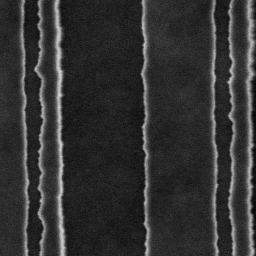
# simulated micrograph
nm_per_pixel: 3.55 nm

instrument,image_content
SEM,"lines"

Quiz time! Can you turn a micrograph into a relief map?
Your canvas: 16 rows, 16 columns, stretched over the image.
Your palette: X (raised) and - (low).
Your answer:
XXXX-----XXXXXXX
XXXX-----XXXXXXX
XXXX-----XXXXXXX
XXXX-----XXXXXXX
XXXX-----XXXXXXX
XXXX-----XXXXXXX
XXXX-----XXXXXXX
XXXX-----XXXXXXX
XXXX-----XXXXXXX
XXXX-----XXXXXXX
XXXX-----XXXXXXX
XXXX-----XXXXXXX
XXXX-----XXXXXXX
XXXX-----XXXXXXX
XXXX-----XXXXXXX
XXXX-----XXXXXXX